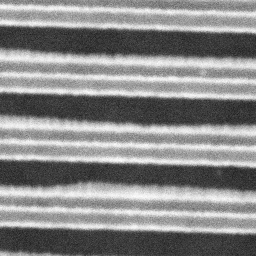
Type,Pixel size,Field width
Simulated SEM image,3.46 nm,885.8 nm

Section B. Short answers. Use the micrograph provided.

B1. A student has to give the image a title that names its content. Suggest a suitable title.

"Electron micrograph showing lines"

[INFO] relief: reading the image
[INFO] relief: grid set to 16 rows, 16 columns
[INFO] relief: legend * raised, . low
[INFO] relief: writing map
****************
****************
................
*...............
****************
****************
................
................
****************
****************
................
................
****************
****************
.............***
................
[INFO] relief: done